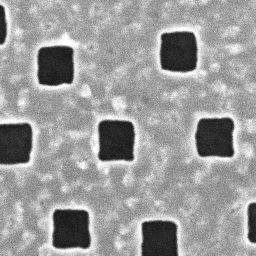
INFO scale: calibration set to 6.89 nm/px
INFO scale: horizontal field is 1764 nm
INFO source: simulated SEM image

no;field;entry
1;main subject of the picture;holes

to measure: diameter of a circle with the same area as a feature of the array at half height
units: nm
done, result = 295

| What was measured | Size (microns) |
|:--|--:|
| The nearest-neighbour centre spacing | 0.664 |